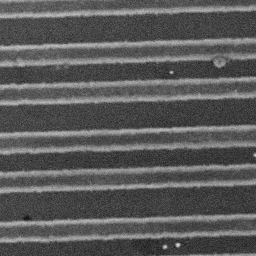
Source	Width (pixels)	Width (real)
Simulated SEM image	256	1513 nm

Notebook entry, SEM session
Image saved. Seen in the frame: lines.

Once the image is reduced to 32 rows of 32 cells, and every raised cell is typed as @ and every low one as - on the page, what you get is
@@@@@@@@@@@@@@@@@@@@@@@@@@@@@@@@
@@@@@@@@@@@@@@@@@---------------
--------------------------------
--------------------------------
--------------------------------
-------------------@@@@@@@@@@@@@
@@@@@@@@@@@@@@@@@@@@@@@@@@@@@@@@
@@@@@@@@@@@@@@@@-----------@----
--------------------------------
--------------------------------
--------------@@@@@@@@@@@@@@@@@@
@@@@@@@@@@@@@@@@@@@@@@@@@@@@@@@@
@@@@@@@@@@@@@-------------------
--------------------------------
--------------------------------
--------------------------------
-------------@-@@@@@@@@@@@@@@@@@
@@@@@@@@@@@@@@@@@@@@@@@@@@@@@@@@
@@@@@@@@@@-@@@------------------
--------------------------------
--------------------------------
----------@@@@@@@@@@@@@@@@@@@@@@
@@@@@@@@@@@@@@@@@@@@@@@@@@@@@@@@
@@@@@@@@@@@@@-------------------
--------------------------------
--------------------------------
--------------------------------
-----------------@@@@@@@@@@@@@@@
@@@@@@@@@@@@@@@@@@@@@@@@@@@@@@@@
@@@@@@@@@@@@@@@@@@--------------
--------------------------------
--------------------------------